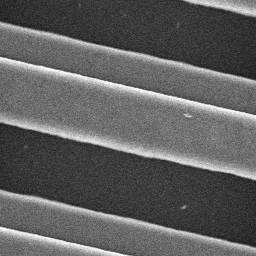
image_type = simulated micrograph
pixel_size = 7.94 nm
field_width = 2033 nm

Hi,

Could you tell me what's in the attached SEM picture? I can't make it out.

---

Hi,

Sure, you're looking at lines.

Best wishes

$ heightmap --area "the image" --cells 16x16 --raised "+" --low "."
..............++
................
++++............
+++++++++.......
+++++++++++++...
++++++++++++++++
++++++++++++++++
++++++++++++++++
....++++++++++++
........++++++++
.............+++
................
++..............
+++++++.........
+++++++++++.....
++++++++++++++++